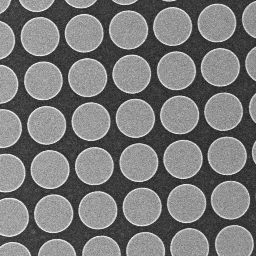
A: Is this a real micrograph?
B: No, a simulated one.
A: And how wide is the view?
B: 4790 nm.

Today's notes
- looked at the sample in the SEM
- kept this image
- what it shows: an array of small figures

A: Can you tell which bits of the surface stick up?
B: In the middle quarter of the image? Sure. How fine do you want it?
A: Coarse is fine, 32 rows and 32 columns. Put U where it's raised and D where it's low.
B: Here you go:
DDUUUUUUUUDDDUUUUUUUUDDUUUUUUUUU
DUUUUUUUUUDDUUUUUUUUUUDUUUUUUUUU
DUUUUUUUUUUDUUUUUUUUUUDDUUUUUUUU
DUUUUUUUUUUDUUUUUUUUUUDDUUUUUUUU
DUUUUUUUUUUDDUUUUUUUUDDDUUUUUUUU
DDUUUUUUUUDDDUUUUUUUUDDDDUUUUUUD
DDUUUUUUUUDDDDUUUUUUDDDDDDDDDDDD
DDDUUUUUDDDDDDDDDDDDDDDDDDDDDDDD
DDDDDDDDDDDDDDDDDDDDDDDDDDDUUUUD
DDDDDDDDDDDDDDDUUUUUDDDDDUUUUUUU
DDDDUUUUUUDDDDUUUUUUUDDDDUUUUUUU
DDDUUUUUUUUDDDUUUUUUUUDDUUUUUUUU
DDUUUUUUUUUDDUUUUUUUUUUDUUUUUUUU
DDUUUUUUUUUDDUUUUUUUUUUDUUUUUUUU
DDUUUUUUUUUDDUUUUUUUUUUDUUUUUUUU
DDUUUUUUUUUDDUUUUUUUUUDDDUUUUUUU
DDUUUUUUUUUDDDUUUUUUUUDDDDUUUUUU
DDDUUUUUUUDDDDDUUUUUUDDDDDDDDUDD
DDDDUUUUUDDDDDDDDDDDDDDDDDDDDDDD
DDDDDDDDDDDDDDDDDDDDDDDDDDDDUUUU
DDDDDDDDDDDDDDDDUUUUUDDDDDUUUUUU
DDDDDUUUUUDDDDDUUUUUUUDDDUUUUUUU
DDDDUUUUUUUDDDUUUUUUUUUDDUUUUUUU
DDDUUUUUUUUUDDUUUUUUUUUDDUUUUUUU
UDDUUUUUUUUUDDUUUUUUUUUDDUUUUUUU
UDDUUUUUUUUUDDUUUUUUUUUDDUUUUUUU
UDDUUUUUUUUUDDUUUUUUUUUDDDUUUUUU
UDDUUUUUUUUUDDDUUUUUUUUDDDDUUUUU
UDDDUUUUUUUDDDDDUUUUUUDDDDDDDUUD
DDDDDUUUUUDDDDDDDDDDDDDDDDDDDDDD
DDDDDDDDDDDDDDDDDDDDDDDDDDDDDUUU
DDDDDDDDDDDDDDDDDUUUUUDDDDDUUUUU